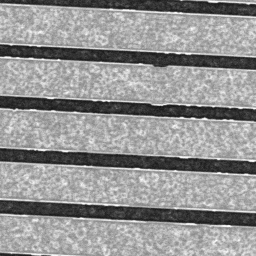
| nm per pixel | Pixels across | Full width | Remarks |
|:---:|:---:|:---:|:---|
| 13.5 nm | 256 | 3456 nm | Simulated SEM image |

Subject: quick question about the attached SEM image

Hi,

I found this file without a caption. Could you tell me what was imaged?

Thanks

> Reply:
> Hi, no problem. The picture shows parallel lines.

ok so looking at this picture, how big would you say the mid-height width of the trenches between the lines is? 0.177 microns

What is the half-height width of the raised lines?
529 nm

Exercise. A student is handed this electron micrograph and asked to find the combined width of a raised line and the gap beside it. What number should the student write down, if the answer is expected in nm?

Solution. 705